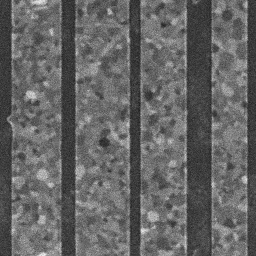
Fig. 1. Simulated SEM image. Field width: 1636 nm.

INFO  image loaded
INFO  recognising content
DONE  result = one or a few lines or trenches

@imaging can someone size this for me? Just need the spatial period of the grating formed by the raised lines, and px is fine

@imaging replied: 64.2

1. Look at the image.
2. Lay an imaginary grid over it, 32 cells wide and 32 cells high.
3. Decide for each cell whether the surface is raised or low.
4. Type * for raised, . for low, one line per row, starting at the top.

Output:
..******..******..*****....****.
..******..******..*****....****.
..******..******..*****....****.
..******..******.******....****.
..******.*******..*****....****.
..******..******..*****....****.
..******..******..*****....****.
..******..******..*****....****.
..******..******..*****....****.
..******..******..*****....****.
..******..******..*****....****.
..******..******..*****....****.
..******..******..*****....****.
..******..******..*****....****.
.*******..******..*****....****.
.*******..******..*****....****.
..******..******..*****....****.
..******..******..*****....****.
..******..******..*****....****.
..******..******..*****....****.
..******..******..*****....****.
..******..******..*****....****.
..******..******..*****....****.
..******..******..*****....****.
..******..******..*****....****.
..******..******..*****....****.
..******..******..*****....****.
..******..******..*****....****.
..******..******..*****....****.
..******..******..*****....****.
..******..******..*****....****.
..******..******..*****....****.